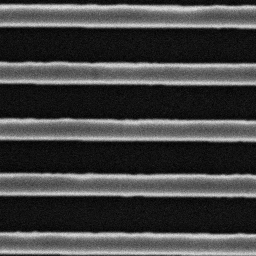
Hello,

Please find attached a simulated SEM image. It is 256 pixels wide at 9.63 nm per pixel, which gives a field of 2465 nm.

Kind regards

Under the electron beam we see lines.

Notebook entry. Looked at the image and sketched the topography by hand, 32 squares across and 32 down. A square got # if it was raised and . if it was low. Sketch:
................................
################################
################################
................................
................................
................................
................................
................................
################################
################################
............................###.
................................
................................
................................
................................
################################
################################
......................##########
................................
................................
................................
................................
################################
################################
.........................#######
................................
................................
................................
................................
################################
################################
################################